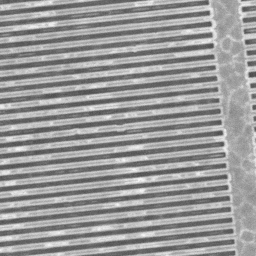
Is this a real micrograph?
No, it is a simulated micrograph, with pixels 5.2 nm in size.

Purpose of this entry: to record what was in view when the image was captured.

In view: parallel lines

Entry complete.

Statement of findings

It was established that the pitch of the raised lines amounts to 57 nm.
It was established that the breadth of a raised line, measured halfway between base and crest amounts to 22.6 nm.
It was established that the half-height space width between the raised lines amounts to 0.0362 micrometres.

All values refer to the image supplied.